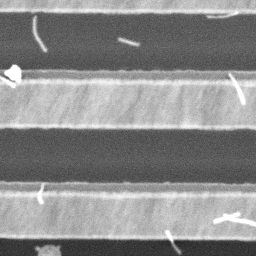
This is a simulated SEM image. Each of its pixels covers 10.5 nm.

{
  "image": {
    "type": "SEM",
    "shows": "lines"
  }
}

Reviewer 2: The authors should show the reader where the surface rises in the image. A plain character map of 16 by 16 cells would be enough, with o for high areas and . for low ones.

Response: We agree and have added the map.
oooooooooooooooo
................
................
................
ooooooooooooooo.
oooooooooooooooo
oooooooooooooooo
oooooooooooooooo
................
................
................
oooooooooooooo..
oooooooooooooooo
oooooooooooooooo
oooooooooooooooo
................